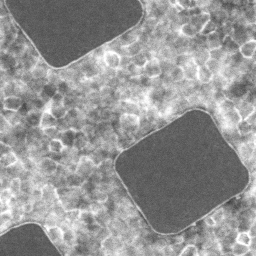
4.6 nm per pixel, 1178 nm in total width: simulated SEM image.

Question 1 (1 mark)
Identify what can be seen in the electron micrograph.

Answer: raised bodies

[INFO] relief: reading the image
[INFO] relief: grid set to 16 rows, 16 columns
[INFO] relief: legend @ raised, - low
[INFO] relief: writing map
@@@@@@@@@-------
-@@@@@@@@-------
--@@@@@---------
---@@-----------
----------------
----------------
----------------
-----------@@---
---------@@@@@--
--------@@@@@@@-
-------@@@@@@@@-
--------@@@@@@@-
--------@@@@@@--
---------@@@@---
@@@-------@-----
@@@@------------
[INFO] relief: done